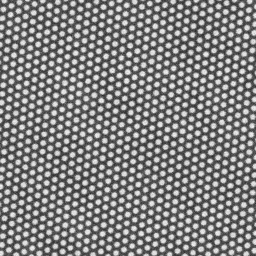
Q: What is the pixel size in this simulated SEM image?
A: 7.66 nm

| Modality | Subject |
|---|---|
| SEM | a regular array of raised bodies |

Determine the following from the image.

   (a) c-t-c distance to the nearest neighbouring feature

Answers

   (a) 65.6 nm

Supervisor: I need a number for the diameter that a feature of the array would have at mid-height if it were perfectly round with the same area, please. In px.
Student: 5.04